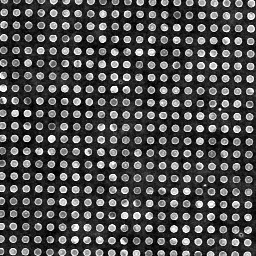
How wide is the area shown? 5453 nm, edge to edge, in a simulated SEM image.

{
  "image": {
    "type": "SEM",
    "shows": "a regular array of raised bodies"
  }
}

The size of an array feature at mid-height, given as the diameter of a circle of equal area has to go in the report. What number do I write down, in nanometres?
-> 154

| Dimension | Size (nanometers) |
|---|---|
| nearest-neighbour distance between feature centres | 259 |